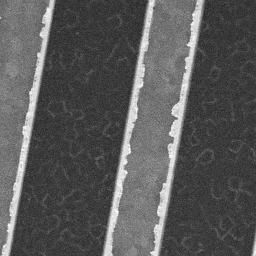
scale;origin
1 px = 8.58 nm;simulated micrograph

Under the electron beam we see one or a few lines or trenches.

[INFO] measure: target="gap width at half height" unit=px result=97.9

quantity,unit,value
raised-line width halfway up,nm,428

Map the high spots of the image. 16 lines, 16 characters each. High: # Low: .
###......####...
###......###....
###......###....
###......###....
##.......###....
##......####....
##......###.....
##......###.....
##......###.....
##......###.....
#.......###.....
#......####.....
#......###......
#......###......
#......###......
.......###......